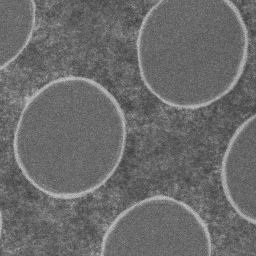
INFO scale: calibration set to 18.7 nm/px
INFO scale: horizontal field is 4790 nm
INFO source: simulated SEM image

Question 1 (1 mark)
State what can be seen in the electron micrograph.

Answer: raised bodies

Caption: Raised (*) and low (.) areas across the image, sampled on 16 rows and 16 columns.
**........*****.
**.......******.
**.......******.
*........******.
.........******.
...***...*****..
..*****....**...
.*******........
.*******.......*
.*******......**
.******.......**
..****........**
.........**...**
........****...*
.......******...
......*******...